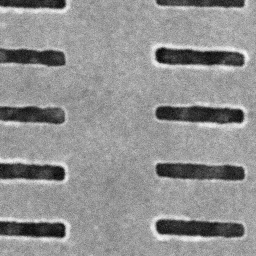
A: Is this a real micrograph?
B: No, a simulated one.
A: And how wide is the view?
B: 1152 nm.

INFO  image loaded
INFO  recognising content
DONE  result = holes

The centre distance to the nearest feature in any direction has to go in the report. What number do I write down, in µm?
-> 0.255